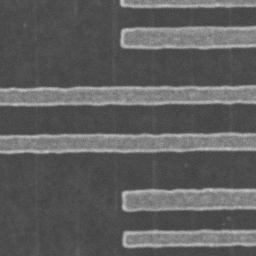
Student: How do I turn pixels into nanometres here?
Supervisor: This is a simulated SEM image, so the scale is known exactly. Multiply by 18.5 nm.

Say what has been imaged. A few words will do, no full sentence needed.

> wiring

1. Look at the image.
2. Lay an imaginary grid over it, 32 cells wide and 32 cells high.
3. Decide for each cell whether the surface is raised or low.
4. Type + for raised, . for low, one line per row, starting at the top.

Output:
................++++++++++++++++
................................
................................
...............................+
...............+++++++++++++++++
...............+++++++++++++++++
................................
................................
................................
................................
................................
++++++++++++++++++++++++++++++++
++++++++++++++++++++++++++++++++
................................
................................
................................
................................
++++++++++++++++++++++++++++++++
++++++++++++++++++++++++++++++++
................................
................................
................................
................................
................................
...............+++++++++++++++++
...............+++++++++++++++++
................................
................................
................................
................++++++++++++++++
................++++++++++++++++
................................